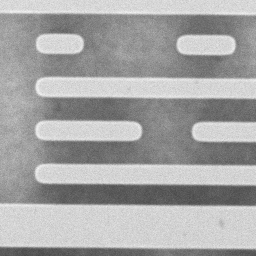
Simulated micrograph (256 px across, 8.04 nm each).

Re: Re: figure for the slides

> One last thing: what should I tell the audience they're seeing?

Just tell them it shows groups of lines, slits or small figures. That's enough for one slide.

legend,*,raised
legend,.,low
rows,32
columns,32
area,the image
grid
********************************
.....***************************
................................
................................
.....*****.............*****....
.....*****............*******...
.....*****.............******...
................................
................................
................................
.....***************************
.....***************************
................................
................................
................................
.....************........*******
.....*************......********
............*****........*******
................................
................................
................................
.....***************************
.....***************************
................................
................................
................................
********************************
********************************
********************************
********************************
********************************
................................